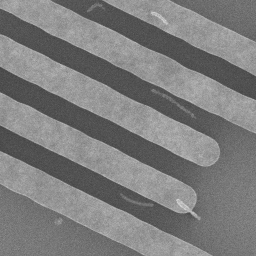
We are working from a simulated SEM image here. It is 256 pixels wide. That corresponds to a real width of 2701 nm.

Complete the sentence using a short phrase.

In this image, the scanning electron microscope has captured groups of lines, slits or small figures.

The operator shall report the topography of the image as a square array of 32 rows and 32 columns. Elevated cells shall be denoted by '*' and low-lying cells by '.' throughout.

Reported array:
*******.......********..........
.********.......********........
...********.......********......
.....********.......********....
*......********.......********..
**.......********.......********
*****......*********......******
*******......*********......****
*********......********.......**
..*********......*********......
....*********......*********....
......*********......*********..
**......*********......*********
****......*********......*******
******......*********......*****
********.......********......***
..********......*********.......
....********......*********.....
......********.......******.....
*.......********......*****.....
***.......********.......**.....
******......********............
*******.......********..........
.********.......********........
...********.......******........
.....*********......****........
.......*********......**........
.........*********..............
...........*********............
.............*********..........
...............*********........
.................*********......